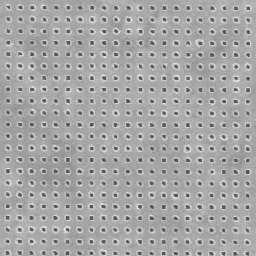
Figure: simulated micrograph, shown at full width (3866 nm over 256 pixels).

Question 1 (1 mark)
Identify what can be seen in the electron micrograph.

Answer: a regular array of holes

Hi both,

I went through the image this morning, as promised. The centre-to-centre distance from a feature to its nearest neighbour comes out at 171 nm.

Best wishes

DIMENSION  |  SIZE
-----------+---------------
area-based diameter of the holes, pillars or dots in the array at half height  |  66 nm